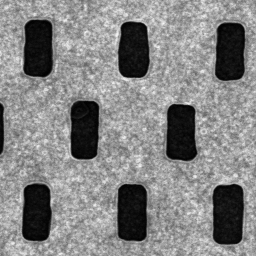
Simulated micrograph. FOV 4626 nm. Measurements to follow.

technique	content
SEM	a regular array of holes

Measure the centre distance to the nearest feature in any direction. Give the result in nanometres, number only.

1700